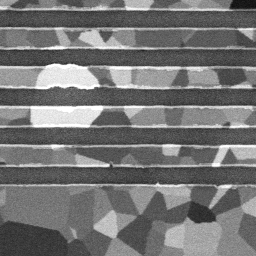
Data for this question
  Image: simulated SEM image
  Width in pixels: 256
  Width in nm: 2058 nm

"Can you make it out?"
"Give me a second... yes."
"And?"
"parallel lines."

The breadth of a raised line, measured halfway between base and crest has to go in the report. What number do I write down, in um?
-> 0.162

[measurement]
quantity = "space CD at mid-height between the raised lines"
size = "154 nm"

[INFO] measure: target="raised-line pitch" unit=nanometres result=314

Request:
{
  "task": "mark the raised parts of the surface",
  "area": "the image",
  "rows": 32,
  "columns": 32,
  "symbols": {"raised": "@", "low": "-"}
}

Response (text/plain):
@@@@@@@@@@@@@@@@@@@@@@@@@@@@@@@@
--------------------------------
--------------------------------
-@@-----------------------------
@@@@@@@@@@@@@@@@@@@@@@@@@@@@@@@@
@@@@@@@@@@@@@@@@@@@@@@@@@@@@@@@@
--------------------------------
--------------------------------
@@@-@@@@@@@@@@----@------@@@@@@-
@@@@@@@@@@@@@@@@@@@@@@@@@@@@@@@@
@@@@@@@@@@@@@@@@@@@@@@@@@@@@@@@@
--------------------------------
--------------------------------
@@@@-----@@@@@@@@@@@@@@@@@@@@@@@
@@@@@@@@@@@@@@@@@@@@@@@@@@@@@@@@
@@@@@@@@@@@@@@@@@@@@@@@@@@@@@@@@
--------------------------------
--------------------------------
@@@@@@@@@@@@@@@@@@@@@@@@@@@@@@@@
@@@@@@@@@@@@@@@@@@@@@@@@@@@@@@@@
@@@@@@@@@@@@@@@@@@@@@@@@@@@@@@@@
--------------------------------
--------------------------------
@@@@@@@@@@@@@@@@@@@@@@@@@@@@@@@@
@@@@@@@@@@@@@@@@@@@@@@@@@@@@@@@@
@@@@@@@@@@@@@@@@@@@@@@@@@@@@@@@@
@@@@@@@@@@@@@@@@@@@@@@@@@@@@@@@@
@@@@@@@@@@@@@@@@@@@@@@@@@@@@@@@@
@@@@@@@@@@@@@@@@@@@@@@@@@@@@@@@@
@@@@@@@@@@@@@@@@@@@@@@@@@@@@@@@@
@@@@@@@@@@@@@@@@@@@@@@@@@@@@@@@@
@@@@@@@@@@@@@@@@@@@@@@@@@@@@@@@@